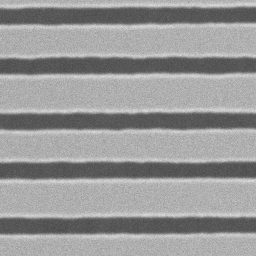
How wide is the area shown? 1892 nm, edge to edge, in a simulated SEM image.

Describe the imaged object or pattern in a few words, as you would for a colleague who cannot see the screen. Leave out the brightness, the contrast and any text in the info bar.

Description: lines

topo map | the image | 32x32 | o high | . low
oooooooooooooooooooooooooooooooo
................................
................................
oooooooooooooooooooooooooooooooo
oooooooooooooooooooooooooooooooo
oooooooooooooooooooooooooooooooo
oooooooooooooooooooooooooooooooo
................................
................................
oooooooooooooooooooooooooooooooo
oooooooooooooooooooooooooooooooo
oooooooooooooooooooooooooooooooo
oooooooooooooooooooooooooooooooo
oooooooooooooooooooooooooooooooo
................................
................................
oooooooooooooooooooooooooooooooo
oooooooooooooooooooooooooooooooo
oooooooooooooooooooooooooooooooo
oooooooooooooooooooooooooooooooo
................................
................................
oooooooooooooooooooooooooooooooo
oooooooooooooooooooooooooooooooo
oooooooooooooooooooooooooooooooo
oooooooooooooooooooooooooooooooo
oooooooooooooooooooooooooooooooo
................................
................................
oooooooooooooooooooooooooooooooo
oooooooooooooooooooooooooooooooo
oooooooooooooooooooooooooooooooo